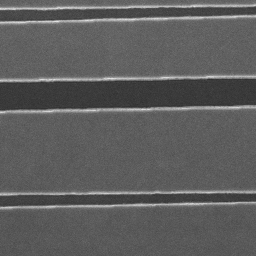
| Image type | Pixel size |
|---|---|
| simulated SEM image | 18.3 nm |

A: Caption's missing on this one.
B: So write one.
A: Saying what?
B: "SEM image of lines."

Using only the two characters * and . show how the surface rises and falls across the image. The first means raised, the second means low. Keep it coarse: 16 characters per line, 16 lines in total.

****************
****************
****************
****************
****************
................
................
****************
****************
****************
****************
****************
****************
****************
****************
****************